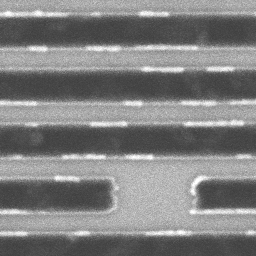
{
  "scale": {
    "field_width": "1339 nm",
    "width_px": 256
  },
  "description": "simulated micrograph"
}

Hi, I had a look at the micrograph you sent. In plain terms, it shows parallel lines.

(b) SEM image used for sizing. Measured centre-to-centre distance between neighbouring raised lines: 0.287 um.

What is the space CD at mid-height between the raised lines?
94.2 nanometers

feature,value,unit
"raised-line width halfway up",37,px